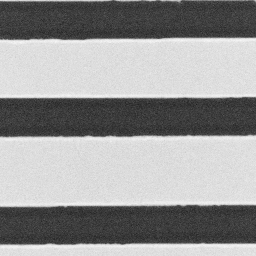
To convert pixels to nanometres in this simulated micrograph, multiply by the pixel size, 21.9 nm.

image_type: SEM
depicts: lines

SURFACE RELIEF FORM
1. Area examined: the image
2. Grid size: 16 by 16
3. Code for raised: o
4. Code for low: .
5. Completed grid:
................
................
..oo.ooooooooooo
oooooooooooooooo
oooooooooooooooo
oooooooooooooooo
................
................
................
oooooooooooooooo
oooooooooooooooo
oooooooooooooooo
oooooooooooooooo
................
................
oooooooooooooooo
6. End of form